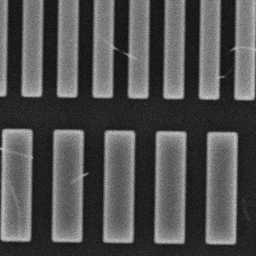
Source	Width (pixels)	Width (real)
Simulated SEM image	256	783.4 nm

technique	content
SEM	groups of lines, slits or small figures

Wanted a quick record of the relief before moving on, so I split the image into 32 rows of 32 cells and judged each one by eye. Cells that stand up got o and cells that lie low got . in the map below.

o..oo..ooo..oo..ooo..oo..oo...oo
o..oo..ooo..oo..ooo..oo..oo...oo
o..oo..ooo..oo..ooo..oo..oo...oo
o..oo..ooo..oo..ooo..oo..oo...oo
o..oo..ooo..oo..oo...oo..oo..ooo
o..oo..ooo..oo..oo...oo..oo..ooo
o..oo..ooo..oo..oo...oo..oo..ooo
o..oo..ooo..oo..oo...oo..oo..ooo
o..oo..ooo..oo..oo...oo..oo..ooo
o..oo..ooo..oo..oo...oo..oo..ooo
o..oo..ooo..oo..oo...oo..oo..ooo
o..oo..ooo..oo..oo...oo..oo..ooo
................................
................................
................................
................................
.ooo...ooo....oo................
oooo...ooo...oooo...ooo...oooo..
oooo...ooo...oooo...ooo...ooo...
oooo...ooo...oooo...ooo...ooo...
oooo...ooo...oooo...ooo...ooo...
oooo...oooo..oooo...ooo...ooo...
oooo...ooo...oooo...ooo...ooo...
oooo...ooo...oooo...ooo...ooo...
oooo...ooo...oooo...ooo...ooo...
oooo...ooo...oooo...ooo...ooo...
oooo...ooo...oooo...ooo...ooo...
oooo...ooo...oooo...ooo...ooo...
oooo...ooo...oooo...ooo...ooo...
oooo...ooo...oooo...ooo...ooo...
................................
................................